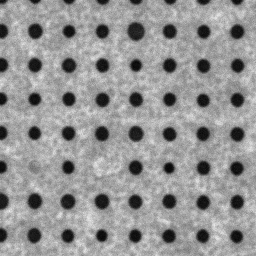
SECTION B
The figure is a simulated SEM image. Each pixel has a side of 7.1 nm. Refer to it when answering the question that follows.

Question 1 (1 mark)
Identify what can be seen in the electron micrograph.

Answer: a regular array of holes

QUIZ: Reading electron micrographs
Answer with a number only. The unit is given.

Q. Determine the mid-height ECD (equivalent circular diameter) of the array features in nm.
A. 104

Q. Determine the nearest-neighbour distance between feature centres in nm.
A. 238